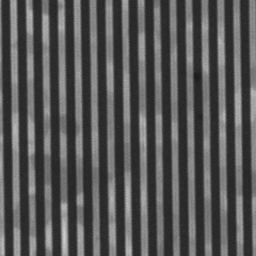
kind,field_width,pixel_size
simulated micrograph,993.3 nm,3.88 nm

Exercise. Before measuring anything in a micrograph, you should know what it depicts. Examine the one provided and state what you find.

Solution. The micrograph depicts parallel lines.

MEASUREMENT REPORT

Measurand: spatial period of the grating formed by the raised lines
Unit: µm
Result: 0.0618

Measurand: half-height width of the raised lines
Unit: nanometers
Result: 23.7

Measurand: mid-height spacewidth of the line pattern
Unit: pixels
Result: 9.61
